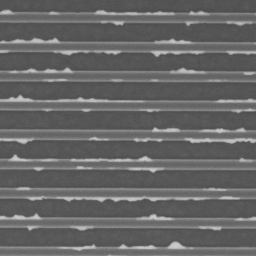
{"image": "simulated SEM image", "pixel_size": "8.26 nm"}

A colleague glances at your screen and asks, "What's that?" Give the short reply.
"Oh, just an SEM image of parallel lines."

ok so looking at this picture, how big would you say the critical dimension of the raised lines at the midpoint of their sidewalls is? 87.7 nm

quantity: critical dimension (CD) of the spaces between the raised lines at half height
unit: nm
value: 151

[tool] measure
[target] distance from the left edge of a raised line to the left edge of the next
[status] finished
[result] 0.242 micrometres